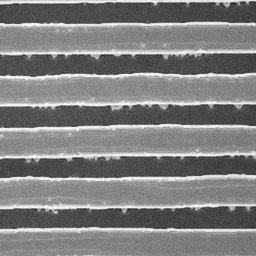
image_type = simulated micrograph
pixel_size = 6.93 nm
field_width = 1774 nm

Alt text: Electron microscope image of lines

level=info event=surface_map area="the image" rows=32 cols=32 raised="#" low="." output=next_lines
................................
................................
................................
################################
################################
################################
################################
................................
................................
......##########################
################################
################################
################################
................................
................................
................................
################################
################################
################################
############....................
................................
................................
################################
################################
################################
################################
................................
................................
...........#....................
################################
################################
################################